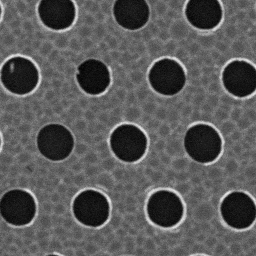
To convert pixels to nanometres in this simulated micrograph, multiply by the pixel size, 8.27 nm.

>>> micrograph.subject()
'holes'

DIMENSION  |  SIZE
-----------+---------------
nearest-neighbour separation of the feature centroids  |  73.6 pixels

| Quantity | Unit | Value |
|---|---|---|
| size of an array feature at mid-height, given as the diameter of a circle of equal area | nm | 311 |